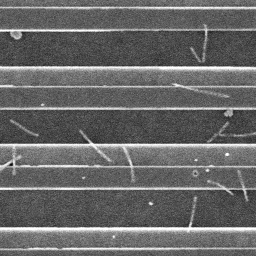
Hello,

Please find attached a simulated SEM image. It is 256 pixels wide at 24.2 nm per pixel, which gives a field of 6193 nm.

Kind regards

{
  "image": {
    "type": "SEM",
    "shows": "lines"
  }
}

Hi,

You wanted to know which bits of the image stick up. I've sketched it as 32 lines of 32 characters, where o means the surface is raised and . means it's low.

oooooooooooooooooooooooooooooooo
oooooooooooooooooooooooooooooooo
oooooooooooooooooooooooooooooooo
oooooooooooooooooooooooooooooooo
................................
................................
................................
................................
oooooooooooooooooooooo..........
oooooooooooooooooooooooooooooooo
oooooooooooooooooooooooooooooooo
oooooooooooooooooooooooooooooooo
oooooooooooooooooooooooooooooooo
oooooooooooooooooooooooooooooooo
................................
................................
................................
................................
oooooooooooooooooooooooooooooooo
oooooooooooooooooooooooooooooooo
oooooooooooooooooooooooooooooooo
oooooooooooooooooooooooooooooooo
oooooooooooooooooooooooooooooooo
oooooooooooooooooooooooooooooooo
................................
................................
................................
................................
................................
oooooooooooooooooooooooooooooooo
oooooooooooooooooooooooooooooooo
oooooooooooooooooooooooooooooooo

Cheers